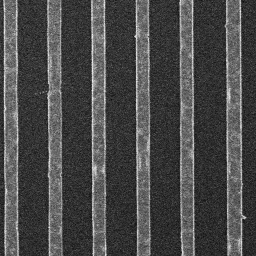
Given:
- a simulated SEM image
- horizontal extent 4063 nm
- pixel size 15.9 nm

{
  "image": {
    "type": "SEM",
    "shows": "parallel lines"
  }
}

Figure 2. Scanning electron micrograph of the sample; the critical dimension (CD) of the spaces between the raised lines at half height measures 502 nm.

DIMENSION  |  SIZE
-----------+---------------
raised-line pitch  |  0.708 um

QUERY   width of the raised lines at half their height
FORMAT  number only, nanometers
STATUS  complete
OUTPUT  202